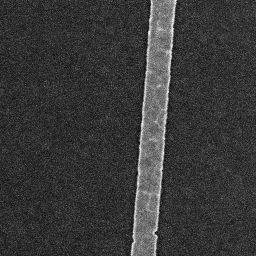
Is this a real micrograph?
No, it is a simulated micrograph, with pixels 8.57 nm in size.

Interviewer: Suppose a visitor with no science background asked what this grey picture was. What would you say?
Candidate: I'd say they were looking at one or a few lines or trenches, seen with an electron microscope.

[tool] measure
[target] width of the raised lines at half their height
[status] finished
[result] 200 nanometers